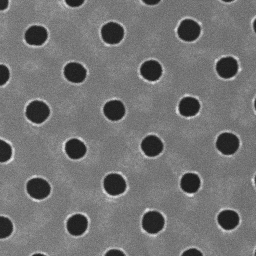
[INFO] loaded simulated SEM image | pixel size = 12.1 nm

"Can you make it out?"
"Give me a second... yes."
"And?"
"a regular array of holes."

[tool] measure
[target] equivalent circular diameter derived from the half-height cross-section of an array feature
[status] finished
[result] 272 nm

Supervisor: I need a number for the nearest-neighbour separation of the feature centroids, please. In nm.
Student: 640